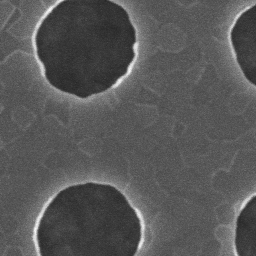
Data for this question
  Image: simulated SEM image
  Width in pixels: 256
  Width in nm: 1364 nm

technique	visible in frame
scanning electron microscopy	holes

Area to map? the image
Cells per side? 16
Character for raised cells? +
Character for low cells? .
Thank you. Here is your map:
+++.....++++++++
+++.....+++++++.
++......++++++..
++......+++++++.
+++.....+++++++.
++++...+++++++++
++++++++++++++++
++++++++++++++++
++++++++++++++++
++++++++++++++++
++++++++++++++++
+++++..+++++++++
+++.....++++++++
+++......++++++.
++.......++++++.
++.......++++++.